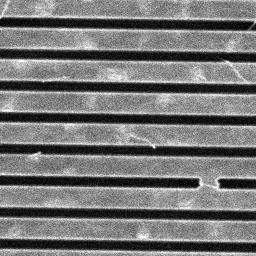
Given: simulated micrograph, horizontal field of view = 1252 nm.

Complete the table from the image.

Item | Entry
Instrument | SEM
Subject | parallel lines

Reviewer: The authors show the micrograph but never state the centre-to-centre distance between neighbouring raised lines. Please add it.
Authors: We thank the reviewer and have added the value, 155 nm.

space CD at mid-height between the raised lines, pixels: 9.63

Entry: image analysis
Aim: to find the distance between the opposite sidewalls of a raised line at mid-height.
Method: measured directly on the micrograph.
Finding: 21.9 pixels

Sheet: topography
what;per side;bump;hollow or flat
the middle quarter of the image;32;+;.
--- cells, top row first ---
++++++++++++++++++++++++++++++++
++++++++++++++++++++++++++++++++
++++++++++++++++++++++++++++++++
++++++++++++++++++++++++++++++++
...................+++++++++++++
................................
................................
++++++++++++++++++++++++++++++++
++++++++++++++++++++++++++++++++
++++++++++++++++++++++++++++++++
++++++++++++++++++++++++++++++++
++++++++++++++++++++++++++++++++
..............++++++++++++++++++
................................
................................
++++++++++++++++++++++++++++++++
++++++++++++++++++++++++++++++++
++++++++++++++++++++++++++++++++
++++++++++++++++++++++++++++++++
++++++++++++++++++++++++++++++++
......................++++++++++
................................
................................
++++++++++++++++++++++++++++++++
++++++++++++++++++++++++++++++++
++++++++++++++++++++++++++++++++
++++++++++++++++++++++++++++++++
++++++++++++++++++++++++++++++++
................................
................................
................................
++++++++++++++++++++++++++++++++